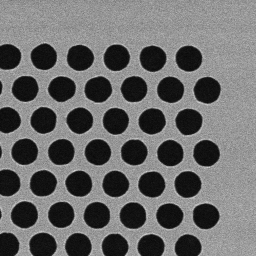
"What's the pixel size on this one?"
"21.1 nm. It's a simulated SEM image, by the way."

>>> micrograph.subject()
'a regular array of holes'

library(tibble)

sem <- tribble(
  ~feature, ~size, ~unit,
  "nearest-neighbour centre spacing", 756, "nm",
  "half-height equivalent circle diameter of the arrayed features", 0.569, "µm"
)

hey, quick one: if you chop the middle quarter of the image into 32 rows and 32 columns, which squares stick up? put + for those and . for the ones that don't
+......++++.....+++......+++....
++....+++++...++++++....++++++..
++++++++++++++++++++++++++++++++
..+++++...+++++....++++++...++++
...+++.....++++.....++++.....+++
...++.......++.......++.......++
...++.......++.......++.......++
..+++.......++.......++.......++
..++++.....++++.....++++.....+++
+++++++...++++++..++++++++..++++
++++++++++++++++++++++++++++++++
++....+++++....+++++....+++++...
+......+++......+++......+++....
.......+++......+++......+++....
+......+++......+++.......++....
+......+++......+++......+++....
++....++++......+++......++++...
+++++++++++...+++++++..+++++++..
++++++++++++++++++++++++++++++++
..++++....++++++....+++++...++++
..+++......++++......+++......++
...++.......++.......++.......++
...++.......++.......++.......++
..+++.......++.......+++......++
..++++.....++++.....++++.....+++
+++++++++++++++++.++++++++.+++++
++++++++++++.+++++++++++++++++++
+.....+++++....+++++....+++++...
+......+++......+++......+++....
.......+++......++.......++.....
.......++.......++.......+++....
+......+++......+++......+++....